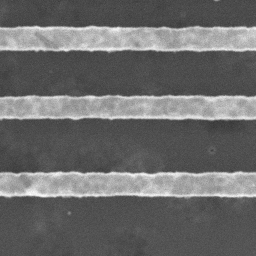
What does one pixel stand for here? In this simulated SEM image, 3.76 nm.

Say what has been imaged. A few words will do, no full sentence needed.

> lines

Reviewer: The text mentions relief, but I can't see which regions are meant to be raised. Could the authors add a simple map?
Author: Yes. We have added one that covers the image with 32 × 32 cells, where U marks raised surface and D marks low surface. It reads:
DDDDDDDDDDDDDDDDDDDDDDDDDDDDDDDD
DDDDDDDDDDDDDDDDDDDDDDDDDDDDDDDD
DDDDDDDDDDDDDDDDDDDDDDDDDDDDDDDD
DDUUUUUUUDUUUUUDDDUDUDDUUUUUDUUU
UUUUUUUUUUUUUUUUUUUUUUUUUUUUUUUU
UUUUUUUUUUUUUUUUUUUUUUUUUUUUUUUU
DDDDDDDDDDDDDDDDDDDDDDDDDDDDDDDD
DDDDDDDDDDDDDDDDDDDDDDDDDDDDDDDD
DDDDDDDDDDDDDDDDDDDDDDDDDDDDDDDD
DDDDDDDDDDDDDDDDDDDDDDDDDDDDDDDD
DDDDDDDDDDDDDDDDDDDDDDDDDDDDDDDD
DDDDDDDDDDDDDDDDDDDDDDDDDDDDDDDD
UUUUUUUUUUUUUUUUUUUUUUUUUUUUUUUU
UUUUUUUUUUUUUUUUUUUUUUUUUUUUUUUU
UUUUUUUUUUUUUUUUUUUUUUUUUUUUUUUU
DDDDDDDDDDDDDDDDDDDDDDDDDDDDDDDD
DDDDDDDDDDDDDDDDDDDDDDDDDDDDDDDD
DDDDDDDDDDDDDDDDDDDDDDDDDDDDDDDD
DDDDDDDDDDDDDDDDDDDDDDDDDDDDDDDD
DDDDDDDDDDDDDDDDDDDDDDDDDDDDDDDD
DDDDDDDDDDDDDDDDDDDDDDDDDDDDDDDD
DDDDDDDDDDDDDDDDDDDDDDDDDDDDDDDD
UUUUUUUUUUUUUUUUUUUUUUUUUUUUUUUU
UUUUUUUUUUUUUUUUUUUUUUUUUUUUUUUU
DDDDDUUDDUDDUDDDDDDDDDUUDDDUUUUU
DDDDDDDDDDDDDDDDDDDDDDDDDDDDDDDD
DDDDDDDDDDDDDDDDDDDDDDDDDDDDDDDD
DDDDDDDDDDDDDDDDDDDDDDDDDDDDDDDD
DDDDDDDDDDDDDDDDDDDDDDDDDDDDDDDD
DDDDDDDDDDDDDDDDDDDDDDDDDDDDDDDD
DDDDDDDDDDDDDDDDDDDDDDDDDDDDDDDD
DDDDDDDDDDDDDDDDDDDDDDDDDDDDDDDD